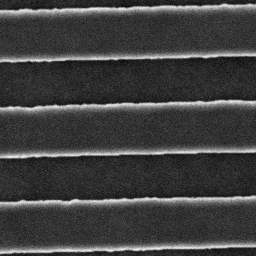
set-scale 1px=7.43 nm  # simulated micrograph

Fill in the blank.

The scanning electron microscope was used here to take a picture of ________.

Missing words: lines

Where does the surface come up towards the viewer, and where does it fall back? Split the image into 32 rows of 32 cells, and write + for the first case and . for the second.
................................
++++++++++++++++++++++++++++++++
++++++++++++++++++++++++++++++++
++++++++++++++++++++++++++++++++
++++++++++++++++++++++++++++++++
++++++++++++++++++++++++++++++++
++++++++++++++++++++++++++++++++
+++++++++.......................
................................
................................
................................
................................
................................
.++.++++++++++++++++++++++++++++
++++++++++++++++++++++++++++++++
++++++++++++++++++++++++++++++++
++++++++++++++++++++++++++++++++
++++++++++++++++++++++++++++++++
++++++++++++++++++++++++++++++++
++++............................
................................
................................
................................
................................
................................
++++++++++++++++++++++++++++++++
++++++++++++++++++++++++++++++++
++++++++++++++++++++++++++++++++
++++++++++++++++++++++++++++++++
++++++++++++++++++++++++++++++++
++++++++++++++++++++++++++++++++
+++++++.........................